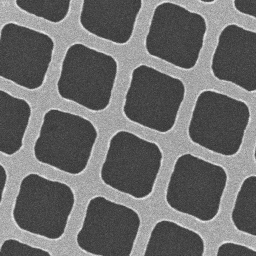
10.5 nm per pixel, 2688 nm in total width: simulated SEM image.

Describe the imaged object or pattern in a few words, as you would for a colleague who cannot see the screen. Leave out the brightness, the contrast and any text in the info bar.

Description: a regular array of holes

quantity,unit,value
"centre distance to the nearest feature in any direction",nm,716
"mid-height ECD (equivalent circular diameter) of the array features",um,0.644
